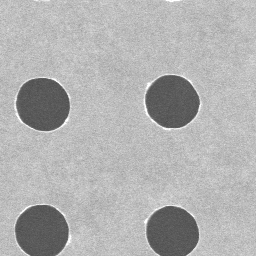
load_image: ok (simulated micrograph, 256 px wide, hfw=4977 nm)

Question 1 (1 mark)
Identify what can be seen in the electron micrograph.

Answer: holes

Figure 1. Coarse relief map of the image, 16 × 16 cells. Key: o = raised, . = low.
oooooooooooooooo
oooooooooooooooo
oooooooooooooooo
oooooooooooooooo
oooooooooooooooo
o...ooooo...oooo
o...ooooo...oooo
o...oooooo..oooo
oooooooooooooooo
oooooooooooooooo
oooooooooooooooo
oooooooooooooooo
oooooooooooooooo
o...ooooo...oooo
o...ooooo...oooo
o...ooooo...oooo